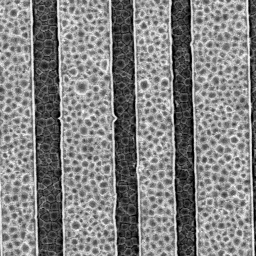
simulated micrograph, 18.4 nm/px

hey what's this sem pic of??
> one or a few lines or trenches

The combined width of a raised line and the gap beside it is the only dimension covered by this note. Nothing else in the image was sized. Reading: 1240 nanometres